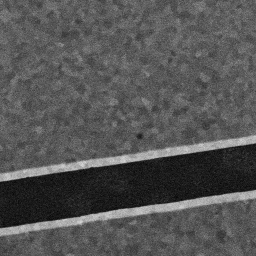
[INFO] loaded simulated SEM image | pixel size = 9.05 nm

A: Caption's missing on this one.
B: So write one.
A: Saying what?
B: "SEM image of one or a few lines or trenches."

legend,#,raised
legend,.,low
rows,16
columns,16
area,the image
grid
################
################
################
################
################
################
################
################
################
###########.....
####............
................
.............###
......##########
################
################